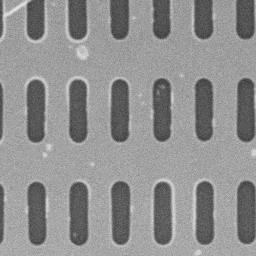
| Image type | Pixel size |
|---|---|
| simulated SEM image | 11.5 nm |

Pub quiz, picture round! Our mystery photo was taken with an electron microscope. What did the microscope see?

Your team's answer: groups of lines, slits or small figures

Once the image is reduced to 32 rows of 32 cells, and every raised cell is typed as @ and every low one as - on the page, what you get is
-@@---@@---@@@--@@@--@@@---@@---
-@@---@@---@@@--@@@--@@@---@@---
-@@---@@---@@@--@@@--@@@---@@---
-@@---@@---@@@--@@@--@@@---@@---
@@@---@@@--@@@--@@@--@@@--@@@@--
@@@@@@@@@@@@@@@@@@@@@@@@@@@@@@@@
@@@@@@@@@@@@@@@@@@@@@@@@@@@@@@@@
@@@@@@@@@@@@@@@@@@@@@@@@@@@@@@@@
@@@@@@@@@@@@@@@@@@@@@@@@@@@@@@@@
@@@@@@@@@@@@@@@@@@@@@@@@@@@@@@@@
@@@---@@@--@@@--@@@--@@@---@@@--
@@@---@@---@@@--@@@---@@---@@@--
-@@---@@---@@@--@@@---@@---@@@--
-@@---@@@--@@@--@@@---@@---@@@--
@@@---@@@--@@@--@@@---@@---@@---
@@@---@@@--@@@--@@@---@@---@@---
@@@---@@@--@@@--@@@--@@@---@@@--
@@@@-@@@@--@@@--@@@@-@@@@-@@@@--
@@@@@@@@@@@@@@@@@@@@@@@@@@@@@@@@
@@@@@@@@@@@@@@@@@@@@@@@@@@@@@@@@
@@@@@@@@@@@@@@@@@@@@@@@@@@@@@@@@
@@@@@@@@@@@@@@@@@@@@@@@@@@@@@@@@
@@@@@@@@@@@@@@@@@@@@@@@@@@@@@@@@
@@@---@@@--@@@--@@@---@@---@@@--
-@@---@@@--@@@--@@@---@@---@@@--
-@@---@@@--@@@--@@@---@@---@@@--
-@@---@@@--@@@--@@@---@@---@@---
-@@---@@@--@@@--@@@---@@---@@@--
-@@---@@@--@@@--@@@---@@---@@@--
-@@---@@@--@@@--@@@---@@---@@@--
@@@@-@@@@--@@@@-@@@@-@@@@-@@@@@@
@@@@@@@@@@@@@@@@@@@@@@@@@@@@@@@@